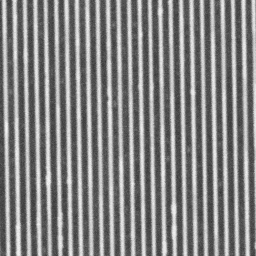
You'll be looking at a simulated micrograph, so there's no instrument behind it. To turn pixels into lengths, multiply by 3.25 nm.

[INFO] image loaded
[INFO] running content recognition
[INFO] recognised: parallel lines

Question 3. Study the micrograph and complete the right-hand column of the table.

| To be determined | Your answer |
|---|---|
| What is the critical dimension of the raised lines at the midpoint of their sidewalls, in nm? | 9.7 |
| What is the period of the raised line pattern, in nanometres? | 33.8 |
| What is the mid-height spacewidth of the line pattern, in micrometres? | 0.0227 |